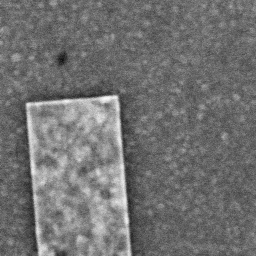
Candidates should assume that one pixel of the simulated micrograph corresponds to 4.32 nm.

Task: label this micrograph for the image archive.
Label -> one or a few lines or trenches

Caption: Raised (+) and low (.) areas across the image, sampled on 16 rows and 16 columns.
................
................
................
................
................
................
..+++++.........
..+++++.........
..++++++........
..++++++........
..++++++........
..++++++........
..++++++........
..++++++........
..++++++........
..++++++........